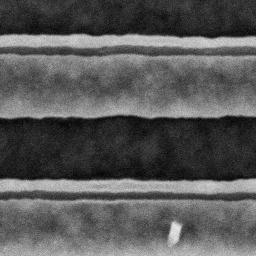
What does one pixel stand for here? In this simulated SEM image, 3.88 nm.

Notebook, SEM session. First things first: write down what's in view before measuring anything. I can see lines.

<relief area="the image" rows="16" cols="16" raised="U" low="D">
DDDDDDDDDDDDDDDD
DDDDDDDDDDDDDDDD
UUUUUUUUUUUUUUUU
UUUUUUUUUUUUUUUU
UUUUUUUUUUUUUUUU
UUUUUUUUUUUUUUUU
UUUUUUUUUUUUUUUU
DDDDDDDDDDDDDDDD
DDDDDDDDDDDDDDDD
DDDDDDDDDDDDDDDD
DDDDDDDDDDDDDDDD
UUUUUUUUUUUUUUUU
UUUUUUUUUUUUUUUU
UUUUUUUUUUUUUUUU
UUUUUUUUUUUUUUUU
UUUUUUUUUUUUUUUU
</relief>